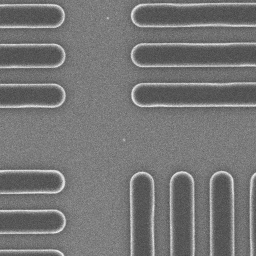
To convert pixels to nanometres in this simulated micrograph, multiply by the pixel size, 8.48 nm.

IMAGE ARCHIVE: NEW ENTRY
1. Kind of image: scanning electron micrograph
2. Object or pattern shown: groups of lines, slits or small figures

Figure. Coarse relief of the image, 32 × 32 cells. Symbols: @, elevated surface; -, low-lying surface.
-------------------------@@@@@@@
@@@@@@@@---------@@@@@@@@@@@@@@@
@@@@@@@@---------@@@@@@@@@@@@@@@
--------------------------------
--------------------------------
------------------@@@@@@----@@@@
@@@@@@@@--------@@@@@@@@@@@@@@@@
@@@@@@@@---------@@@@@@@@@@@@@@@
--------------------------------
--------------------------------
-----------------@@@@@@@@@@-@@@@
@@@@@@@@---------@@@@@@@@@@@@@@@
@@@@@@@@---------@@@@@@@@@@@@@@@
--------------------------------
--------------------------------
--------------------------------
--------------------------------
--------------------------------
--------------------------------
--------------------------------
--------------------------------
@@@@@@@--------------------@----
@@@@@@@@--------@@@--@@@--@@@--@
@@@@@@@@--------@@@--@@@--@@@--@
----------------@@@--@@@--@@@--@
----------------@@@--@@@--@@@--@
@@@@@@@@--------@@@--@@@--@@@--@
@@@@@@@@--------@@@--@@@--@@@--@
@@@@@@@@--------@@@--@@@--@@@--@
----------------@@@--@@@--@@@--@
----------------@@@--@@@--@@@--@
@@@@@@@---------@@@--@@@--@@@--@